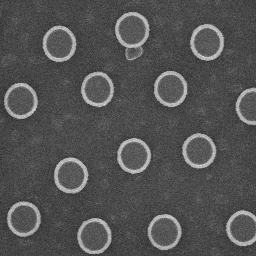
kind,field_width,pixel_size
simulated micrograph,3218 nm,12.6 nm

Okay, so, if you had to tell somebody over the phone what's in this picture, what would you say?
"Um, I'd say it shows a regular array of raised bodies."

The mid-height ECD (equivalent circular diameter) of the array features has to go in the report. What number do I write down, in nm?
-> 396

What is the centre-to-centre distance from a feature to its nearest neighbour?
813 nanometres